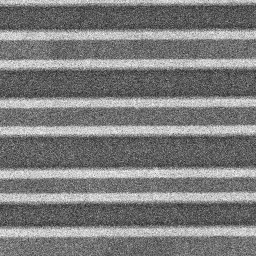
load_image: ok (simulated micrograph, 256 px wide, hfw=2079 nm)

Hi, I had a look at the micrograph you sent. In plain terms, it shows one or a few lines or trenches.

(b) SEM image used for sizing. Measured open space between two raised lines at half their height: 318 nanometers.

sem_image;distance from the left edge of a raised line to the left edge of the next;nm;552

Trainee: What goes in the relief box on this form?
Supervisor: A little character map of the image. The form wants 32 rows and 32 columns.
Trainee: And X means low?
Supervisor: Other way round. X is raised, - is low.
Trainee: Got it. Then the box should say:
--------------------------------
--------------------------------
--------------------------------
--------------------------------
X--XX---------X---XX--XXXXXXXXXX
XXXXXXXXXXXXXXXXXXXXXXXXXXXXXXXX
XXXXXXXXXXXXXXXXXXXXXXXXXXXXXXXX
XXXXXXXXXXXXXXXXXXXXXXXXXXXXXXXX
--------------------------------
--------------------------------
--------------------------------
--------------------------------
--------------------------------
XXXXXXXXXXXXXXXXXXXXXXXXXXXXXXXX
XXXXXXXXXXXXXXXXXXXXXXXXXXXXXXXX
XXXXXXXXXXXXXXXXXXXXXXXXXXXXXXXX
--------------------------------
--------------------------------
--------------------------------
--------------------------------
--------------------------------
--------------------------------
XXXXXXXXXXXXXXXXXXXXXXXXXXXXXXXX
XXXXXXXXXXXXXXXXXXXXXXXXXXXXXXXX
XXXXXXXXXXXXXXXXXXXXXXXXXXXXXXXX
--------------------------------
--------------------------------
--------------------------------
--------------------------------
XXXXXXXXXXXXXXXXXXXXXXXXXXXXXXXX
XXXXXXXXXXXXXXXXXXXXXXXXXXXXXXXX
XXXXXXXXXXXXXXXXXXXXXXXXXXXXXXXX